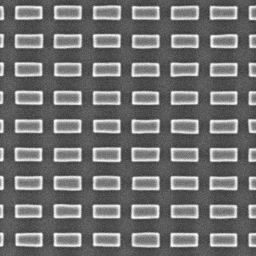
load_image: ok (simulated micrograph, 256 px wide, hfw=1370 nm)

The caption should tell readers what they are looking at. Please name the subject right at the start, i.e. groups of lines, slits or small figures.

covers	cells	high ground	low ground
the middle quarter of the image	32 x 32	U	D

UUUUDDDUUUUUUUDDDUUUUUUUDDDUUUUU
UUUUDDDUUUUUUUDDDUUUUUUUDDDUUUUU
UUUUDDDUUUUUUUDDDUUUUUUUDDDUUUUU
DDDDDDDDDDDDDDDDDDDDDDDDDDDDDDDD
DDDDDDDDDDDDDDDDDDDDDDDDDDDDDDDD
DDDDDDDDDDDDDDDDDDDDDDDDDDDDDDDD
DDDDDDDDDDDDDDDDDDDDDDDDDDDDDDDD
UUUUDDDUUUUUUUDDDUUUUUUUDDDUUUUU
UUUUDDDUUUUUUUDDDUUUUUUUDDDUUUUU
UUUUDDDUUUUUUUDDDUUUUUUUDDDUUUUU
DDDDDDDDDDDDDDDDDDDDDDDDDDDDDDDD
DDDDDDDDDDDDDDDDDDDDDDDDDDDDDDDD
DDDDDDDDDDDDDDDDDDDDDDDDDDDDDDDD
DDDDDDDDDDDDDDDDDDDDDDDDDDDDDDDD
UUUUDDDDUUUUUUDDDUUUUUUUDDDUUUUU
UUUUDDDDUUUUUUDDDUUUUUUUDDDUUUUU
UUUUDDDDUUUUUUDDDUUUUUUUDDDUUUUU
DDDDDDDDDDDDDDDDDDDDDDDDDDDDDDDD
DDDDDDDDDDDDDDDDDDDDDDDDDDDDDDDD
DDDDDDDDDDDDDDDDDDDDDDDDDDDDDDDD
DDDDDDDDDDDDDDDDDDDDDDDDDDDDDDDD
UUUUDDDUUUUUUUDDDUUUUUUUDDDUUUUU
UUUUDDDUUUUUUUDDDUUUUUUUDDDUUUUU
UUUUDDDUUUUUUUDDDUUUUUUUDDDUUUUU
DDDDDDDDDDDDDDDDDDDDDDDDDDDDDDDD
DDDDDDDDDDDDDDDDDDDDDDDDDDDDDDDD
DDDDDDDDDDDDDDDDDDDDDDDDDDDDDDDD
DDDDDDDDDDDDDDDDDDDDDDDDDDDDDDDD
UUUUDDDDUUUUUUDDDDUUUUUUDDDUUUUU
UUUUDDDUUUUUUUDDDUUUUUUUDDDUUUUU
UUUUDDDUUUUUUUDDDUUUUUUUDDDUUUUU
DDDDDDDDDDDDDDDDDDDDDDDDDDDDDDDD